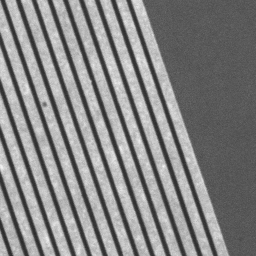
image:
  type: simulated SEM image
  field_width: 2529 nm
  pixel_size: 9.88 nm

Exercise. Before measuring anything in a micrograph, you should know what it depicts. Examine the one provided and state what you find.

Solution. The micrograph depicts parallel lines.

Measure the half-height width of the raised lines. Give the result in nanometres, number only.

95.9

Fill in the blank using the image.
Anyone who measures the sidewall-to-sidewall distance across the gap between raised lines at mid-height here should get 5.32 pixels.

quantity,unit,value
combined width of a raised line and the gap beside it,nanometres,148